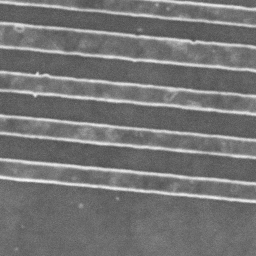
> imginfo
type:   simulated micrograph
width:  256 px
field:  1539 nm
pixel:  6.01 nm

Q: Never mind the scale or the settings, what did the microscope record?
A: parallel lines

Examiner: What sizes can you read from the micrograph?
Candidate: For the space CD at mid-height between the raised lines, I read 149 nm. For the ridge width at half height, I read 112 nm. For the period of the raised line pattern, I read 265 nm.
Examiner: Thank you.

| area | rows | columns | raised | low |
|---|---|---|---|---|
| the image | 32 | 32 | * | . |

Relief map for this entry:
..***********************.......
.............*******************
.......................*********
*******.........................
*****************...............
***************************.....
.......*************************
.................***************
............................****
******..........................
****************................
..************************......
.............*******************
.......................*********
*...............................
***********.....................
**********************..........
........************************
...................*************
.............................***
******..........................
*****************...............
...*************************....
..............******************
........................********
................................
................................
................................
................................
................................
................................
................................